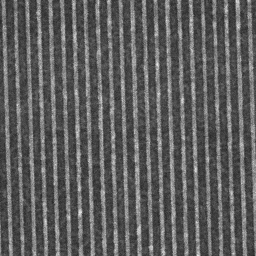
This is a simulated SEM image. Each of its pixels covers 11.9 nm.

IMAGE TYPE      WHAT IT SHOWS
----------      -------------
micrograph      parallel lines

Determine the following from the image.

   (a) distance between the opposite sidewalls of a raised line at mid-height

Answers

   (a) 2.75 px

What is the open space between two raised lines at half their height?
104 nanometres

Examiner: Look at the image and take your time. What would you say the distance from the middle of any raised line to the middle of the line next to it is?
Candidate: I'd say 11.7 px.